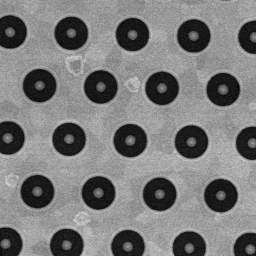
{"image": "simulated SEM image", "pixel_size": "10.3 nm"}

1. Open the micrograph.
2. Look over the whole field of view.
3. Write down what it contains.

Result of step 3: an array of small figures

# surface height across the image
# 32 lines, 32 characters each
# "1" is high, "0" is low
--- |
11111111111111111111111111111111
11111111111111111111111111111111
00011110001111100011111001111110
00011110000111000001110000111100
00011110000111000001110000111100
00011110000111100011110000111100
11111111111111110111111001111110
11111111111111111111111111111111
11111111111111111111111111111111
11100001111000111110001111000111
11100001110000011100001111000011
11100001110000011100001111000011
11110011111000111110001111000011
11111111111111111111111111111111
11111111111111111111111111111111
00111110001111100111111111111111
00011110000111000011110000111100
00011100000111000011110000111000
00011110000111000011110000111000
11111111001111100111111001111100
11111111111111111111111111111111
11111111111111111111111111111111
11100011111000111110011111100111
11000001110000111100001111000011
11100001110000111100001110000011
11100011111000111100001111000011
11111111111111111111111111101111
11111111111111111111111111111111
00111111011111111111111111111111
00011100001111000011110001111100
00011100000111000011100000111000
00011100001111000011100000111000